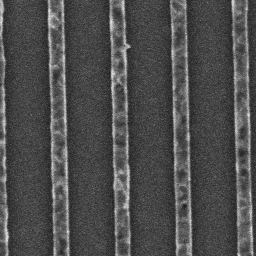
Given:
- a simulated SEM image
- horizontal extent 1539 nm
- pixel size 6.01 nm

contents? one or a few lines or trenches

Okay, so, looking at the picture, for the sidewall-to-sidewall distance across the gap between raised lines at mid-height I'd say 284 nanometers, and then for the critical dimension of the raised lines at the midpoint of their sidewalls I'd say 0.0856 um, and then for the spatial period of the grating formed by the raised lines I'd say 368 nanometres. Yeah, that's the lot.